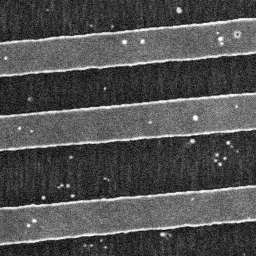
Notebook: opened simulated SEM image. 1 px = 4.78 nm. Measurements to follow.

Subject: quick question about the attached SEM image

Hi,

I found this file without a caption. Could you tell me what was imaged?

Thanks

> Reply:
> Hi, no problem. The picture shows lines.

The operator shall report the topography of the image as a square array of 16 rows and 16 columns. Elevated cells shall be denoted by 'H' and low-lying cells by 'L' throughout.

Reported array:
LLLLLLLLLLLLLLLL
LLLLLLLLLLLLHHHH
LLHHHHHHHHHHHHHH
HHHHHHHHHHHHHHLL
HHHHLLLLLLLLLLLL
LLLLLLLLLLLLLLLL
LLLLLLLLHHHHHHHH
HHHHHHHHHHHHHHHH
HHHHHHHHHHHLLLLL
LLLLLLLLLLLLLLLL
LLLLLLLLLLLLLLLL
LLLLLLLLLLLLLLLL
LLLLLLHHHHHHHHHH
HHHHHHHHHHHHHHHH
HHHHHHHHLLLLLLLL
LLLLLLLLLLLLLLLL